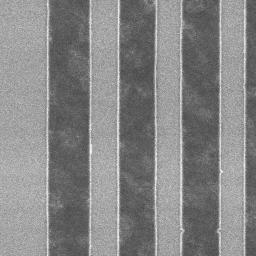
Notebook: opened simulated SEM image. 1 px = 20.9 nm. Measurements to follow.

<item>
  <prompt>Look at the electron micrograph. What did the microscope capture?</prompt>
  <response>one or a few lines or trenches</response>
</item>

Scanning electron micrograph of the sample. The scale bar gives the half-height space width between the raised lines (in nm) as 513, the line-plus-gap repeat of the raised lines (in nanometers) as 1380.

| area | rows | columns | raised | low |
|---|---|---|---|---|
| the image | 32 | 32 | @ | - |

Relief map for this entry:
------@@@@@----@@@@----@@@@@---@
------@@@@@----@@@@@---@@@@@---@
------@@@@@----@@@@----@@@@@---@
------@@@@@----@@@@----@@@@@---@
------@@@@@----@@@@----@@@@@---@
------@@@@@----@@@@----@@@@@---@
------@@@@@----@@@@----@@@@@---@
------@@@@@----@@@@----@@@@@---@
------@@@@@----@@@@----@@@@@---@
------@@@@@----@@@@----@@@@@---@
------@@@@@----@@@@----@@@@@--@@
------@@@@@----@@@@----@@@@@---@
------@@@@@----@@@@----@@@@@---@
------@@@@@----@@@@----@@@@@---@
------@@@@@----@@@@----@@@@@---@
------@@@@@----@@@@----@@@@@---@
------@@@@@----@@@@----@@@@@---@
------@@@@@----@@@@----@@@@@---@
------@@@@@----@@@@----@@@@@---@
------@@@@@----@@@@----@@@@@---@
------@@@@@----@@@@----@@@@@---@
------@@@@@----@@@@----@@@@@---@
------@@@@@----@@@@----@@@@@---@
------@@@@@----@@@@----@@@@@---@
------@@@@@----@@@@----@@@@@---@
------@@@@@----@@@@----@@@@@---@
------@@@@@----@@@@----@@@@@---@
------@@@@@----@@@@----@@@@@---@
------@@@@@----@@@@----@@@@@---@
------@@@@@----@@@@@---@@@@@---@
------@@@@@----@@@@@---@@@@@---@
------@@@@@----@@@@----@@@@@---@